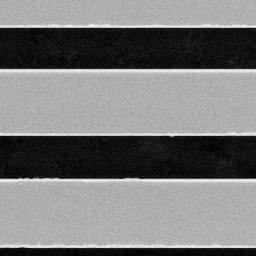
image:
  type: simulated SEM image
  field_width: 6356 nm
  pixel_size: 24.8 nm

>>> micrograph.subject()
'lines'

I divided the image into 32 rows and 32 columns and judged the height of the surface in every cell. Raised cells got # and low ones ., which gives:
################################
################################
################################
................................
................................
................................
................................
................................
................................
################################
################################
################################
################################
################################
################################
################################
################################
................................
................................
................................
................................
................................
################################
################################
################################
################################
################################
################################
################################
################################
################################
................................